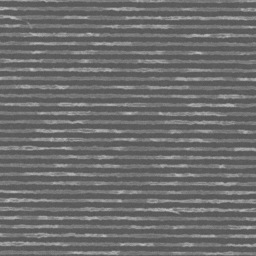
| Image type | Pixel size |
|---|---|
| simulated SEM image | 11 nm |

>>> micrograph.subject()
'parallel lines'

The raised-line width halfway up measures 30.2 nm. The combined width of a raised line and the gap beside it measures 95.9 nm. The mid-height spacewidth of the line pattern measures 67.4 nm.